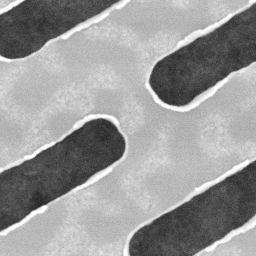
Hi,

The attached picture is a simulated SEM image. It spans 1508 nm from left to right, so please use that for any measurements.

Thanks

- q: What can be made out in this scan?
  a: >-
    holes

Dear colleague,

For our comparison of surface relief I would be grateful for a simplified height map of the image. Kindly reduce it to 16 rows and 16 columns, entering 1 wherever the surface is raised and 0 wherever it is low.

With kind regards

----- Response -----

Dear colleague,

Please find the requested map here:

1000000111111110
0000011111111100
0001111111110000
0011111111000000
1111111110000001
1111111110000111
1111111111001111
1111110111111111
1111000011111111
1110000011111111
1000000111111110
0000011111111000
0001111111110000
0011111111000000
1111111110000011
1111111100000111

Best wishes